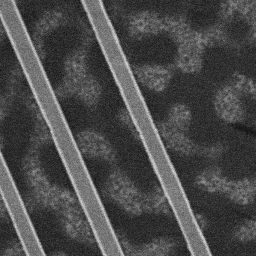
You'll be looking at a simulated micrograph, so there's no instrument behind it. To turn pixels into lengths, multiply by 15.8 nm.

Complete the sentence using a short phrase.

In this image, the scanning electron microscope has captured one or a few lines or trenches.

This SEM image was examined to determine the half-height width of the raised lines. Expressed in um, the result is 0.255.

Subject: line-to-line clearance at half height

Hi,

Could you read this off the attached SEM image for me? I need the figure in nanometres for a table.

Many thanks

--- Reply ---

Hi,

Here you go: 1000